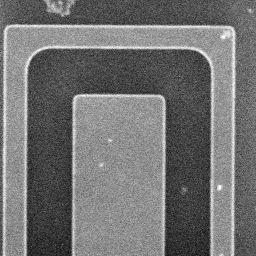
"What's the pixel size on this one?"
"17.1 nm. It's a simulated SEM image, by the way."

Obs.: groups of lines, slits or small figures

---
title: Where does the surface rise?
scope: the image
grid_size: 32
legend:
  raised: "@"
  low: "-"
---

--------------------------------
--------------------------------
--------------------------------
-@@@@@@@@@@@@@@@@@@@@@@@@@@@@---
-@@@@@@@@@@@@@@@@@@@@@@@@@@@@---
-@@@@@@@@@@@@@@@@@@@@@@@@@@@@---
-@@@@--------------------@@@@---
-@@@----------------------@@@---
-@@-----------------------@@@---
-@@------------------------@@---
-@@------------------------@@---
-@@------------------------@@---
-@@------@@@@@@@@@@@-------@@---
-@@------@@@@@@@@@@@@------@@---
-@@------@@@@@@@@@@@@------@@---
-@@------@@@@@@@@@@@@------@@---
@@@------@@@@@@@@@@@@------@@---
@@@------@@@@@@@@@@@@------@@---
@@@------@@@@@@@@@@@@------@@---
@@@------@@@@@@@@@@@@------@@---
@@@------@@@@@@@@@@@@------@@---
@@@------@@@@@@@@@@@------@@@---
@@@------@@@@@@@@@@@------@@@---
@@@------@@@@@@@@@@@------@@@---
@@@------@@@@@@@@@@@------@@@---
@@@------@@@@@@@@@@@------@@@---
@@@------@@@@@@@@@@@------@@@---
@@@------@@@@@@@@@@@------@@@---
@@@------@@@@@@@@@@@------@@@---
@@@------@@@@@@@@@@@------@@@---
@@@------@@@@@@@@@@@------@@@---
@@@------@@@@@@@@@@@------@@@---